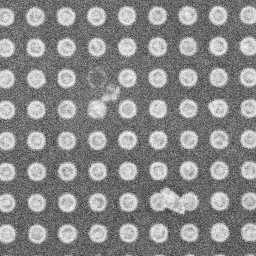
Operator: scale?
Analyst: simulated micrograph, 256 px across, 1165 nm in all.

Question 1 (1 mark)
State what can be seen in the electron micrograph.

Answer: a regular array of raised bodies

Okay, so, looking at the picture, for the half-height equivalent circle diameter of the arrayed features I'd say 70.3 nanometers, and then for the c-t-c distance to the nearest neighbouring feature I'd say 138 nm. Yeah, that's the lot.